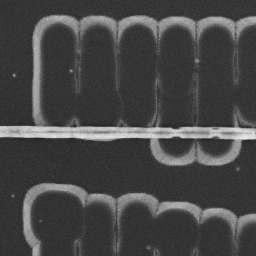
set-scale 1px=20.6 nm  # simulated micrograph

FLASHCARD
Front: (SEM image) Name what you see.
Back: wiring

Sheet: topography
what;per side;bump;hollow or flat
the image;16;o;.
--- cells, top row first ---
................
...oooo.oooo.o.o
..oooooooooooooo
..oooooooooooooo
..oooooooooooooo
..oooooooooooooo
..oooooooooooooo
..oooooooooooooo
.ooooooooooooooo
..........ooooo.
................
................
..ooooo.o.......
..oooooooooooo..
..oooooooooooooo
..oooooooooooooo